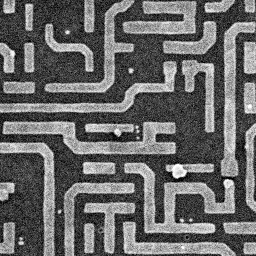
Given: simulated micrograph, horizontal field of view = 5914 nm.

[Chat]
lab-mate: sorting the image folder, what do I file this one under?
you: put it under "wiring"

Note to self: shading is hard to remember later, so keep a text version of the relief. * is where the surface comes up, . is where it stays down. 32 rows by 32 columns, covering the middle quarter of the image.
......*...**.............***..**
......*...**....*........***..**
..........**.............***..**
..........**..............*....*
.........***.............**....*
***********......**********....*
***********.....***********....*
...............***..............
...............**...............
...............**...............
****************................
***************.................
................................
................................
................................
***...***********...********....
***...***********...********....
***..........*......***.........
***.................***.........
****...............****.........
.***************************....
..**************************....
................................
................................
................................
.....*******...******.....******
.....********..*******....******
...................***.....***..
....................**..........
....................**..........
..***************...**...*******
.****************...**...*******